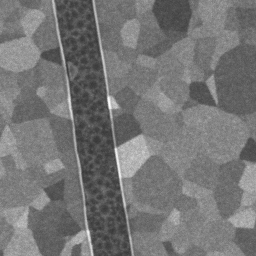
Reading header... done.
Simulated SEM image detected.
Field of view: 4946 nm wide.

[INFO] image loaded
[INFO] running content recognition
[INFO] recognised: one or a few lines or trenches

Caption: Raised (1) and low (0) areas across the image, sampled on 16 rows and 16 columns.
1110001111111111
1111001111111111
1111001111111111
1111001111111111
1111000111111111
1111000111111111
1111000111111111
1111100111111111
1111100111111111
1111100111111111
1111100111111111
1111100011111111
1111100011111111
1111100011111111
1111110011111111
1111110011111111